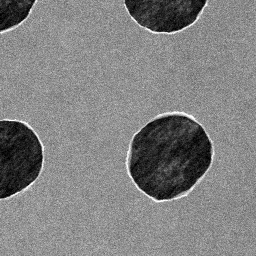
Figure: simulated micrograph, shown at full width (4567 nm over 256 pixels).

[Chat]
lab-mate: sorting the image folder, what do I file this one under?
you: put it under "holes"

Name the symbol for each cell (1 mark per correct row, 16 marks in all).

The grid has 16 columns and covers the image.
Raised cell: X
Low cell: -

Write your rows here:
--XXXXXX-----XXX
-XXXXXXXX---XXXX
XXXXXXXXXXXXXXXX
XXXXXXXXXXXXXXXX
XXXXXXXXXXXXXXXX
XXXXXXXXXXXXXXXX
XXXXXXXXXXXXXXXX
XXXXXXXXXX--XXXX
--XXXXXX-----XXX
---XXXXX-----XXX
---XXXXX-----XXX
--XXXXXXX---XXXX
XXXXXXXXXXXXXXXX
XXXXXXXXXXXXXXXX
XXXXXXXXXXXXXXXX
XXXXXXXXXXXXXXXX